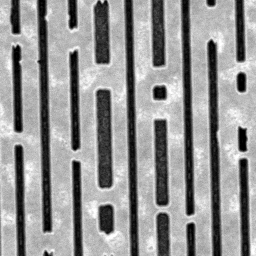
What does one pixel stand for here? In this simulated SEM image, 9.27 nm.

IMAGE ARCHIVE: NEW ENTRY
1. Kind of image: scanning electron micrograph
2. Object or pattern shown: parallel lines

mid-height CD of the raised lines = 164 nanometres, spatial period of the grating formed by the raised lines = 260 nm